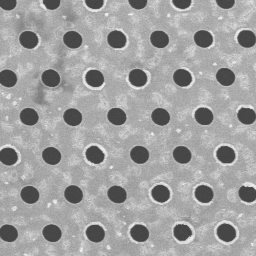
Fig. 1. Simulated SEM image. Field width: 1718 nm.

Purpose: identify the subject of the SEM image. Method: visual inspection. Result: a regular array of holes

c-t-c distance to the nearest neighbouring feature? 291 nm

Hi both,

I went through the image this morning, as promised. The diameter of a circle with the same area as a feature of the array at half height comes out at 120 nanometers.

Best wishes